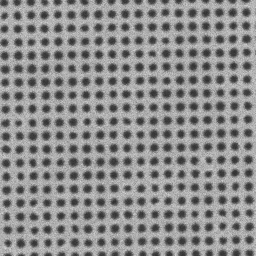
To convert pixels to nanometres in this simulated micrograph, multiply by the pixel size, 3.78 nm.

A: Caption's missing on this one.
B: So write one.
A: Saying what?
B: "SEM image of a regular array of holes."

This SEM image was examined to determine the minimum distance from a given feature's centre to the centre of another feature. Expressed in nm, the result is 49.8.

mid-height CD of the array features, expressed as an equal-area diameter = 31.4 nm